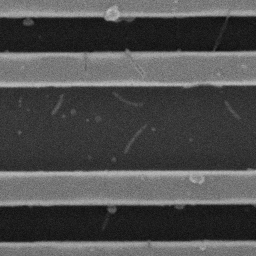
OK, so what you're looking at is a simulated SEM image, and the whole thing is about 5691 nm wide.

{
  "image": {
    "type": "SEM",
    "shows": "lines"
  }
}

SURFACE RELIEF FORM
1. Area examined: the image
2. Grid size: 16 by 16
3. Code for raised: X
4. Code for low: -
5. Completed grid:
XXXXXXXXXXXXXXXX
----------------
----------------
XXXXXXXXXXXXXXXX
XXXXXXXXXXXXXXXX
----------------
----------------
----------------
----------------
----------------
----------------
XXXXXXXXXXXXXXXX
XXXXXXXXXXXXXXXX
----------------
----------------
XXXXXXXXXXXXXXXX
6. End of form